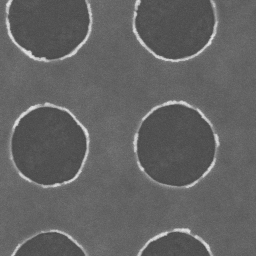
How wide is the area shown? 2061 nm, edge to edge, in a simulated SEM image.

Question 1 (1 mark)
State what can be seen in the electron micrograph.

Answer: holes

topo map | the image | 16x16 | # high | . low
#....####....###
#.....##.....###
#....####....###
##..######..####
################
################
################
#....####....###
#....####....###
#....####....###
#....####....###
##########..####
################
################
################
#....####....###